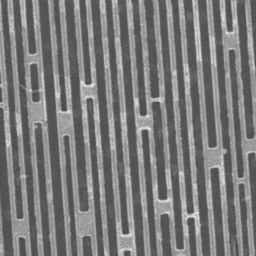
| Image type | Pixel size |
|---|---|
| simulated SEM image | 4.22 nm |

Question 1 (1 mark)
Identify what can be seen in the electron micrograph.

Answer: parallel lines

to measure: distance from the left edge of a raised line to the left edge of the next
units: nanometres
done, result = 55.4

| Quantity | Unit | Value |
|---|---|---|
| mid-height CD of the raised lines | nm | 16.3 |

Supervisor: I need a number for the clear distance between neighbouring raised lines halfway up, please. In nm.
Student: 36.8